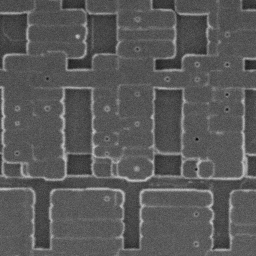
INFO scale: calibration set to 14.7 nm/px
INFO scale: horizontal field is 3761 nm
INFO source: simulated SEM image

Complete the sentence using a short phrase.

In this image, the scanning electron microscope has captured wiring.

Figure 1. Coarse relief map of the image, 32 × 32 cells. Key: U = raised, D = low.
UUUUUUUUDDDUUUUUUUUDDDUUUUUUUUDD
UUUUUUUUUUUUUUUUUUUUUUUUUUUUUUUU
DDDDUUUUUUUDDDDUUUUUUUDDDDUUUUUU
DDDDUUUUUUUDDDDUUUUUUUDDDDUUUUUU
DDDDUUUUUUUDDDDUUUUUUUDDDDUUUUUU
DDDDUUUUUUUDDDDUUUUUUUDDDDUUUUUU
DDDUUUUUUUUDDDUUUUUUUUDDDDUUUUUU
UUUUUUUUUDDDUUUUUUUUDDDUUUUUUUUD
UUUUUUUUUDDUUUUUUUUUDDUUUUUUUUUD
UUUUUUUUUUUUUUUUUUUUUUUUUUUUUUUU
UUUUUUUUUUUUUUUUUUUUUUUUUUUUUUUU
UUUUUUUUDDDDUUUUUUUDDDDUUUUUUUUD
UUUUUUUUDDDDUUUUUUUDDDDUUUUUUUDD
UUUUUUUUDDDDUUUUUUUDDDDUUUUUUUDD
UUUUUUUUDDDDUUUUUUUDDDDUUUUUUUDD
UUUUUUUUDDDDUUUUUUUDDDDUUUUUUUDD
UUUUUUUUDDDDUUUUUUUDDDDUUUUUUUDD
UUUUUUUUDDDDUUUUUUUDDDDUUUUUUUDD
UUUUUUUUDDDDUUUUUUUDDDDUUUUUUUDD
UUUUUUUUDDDDUUUUUUUDDDDUUUUUUUDD
DDUUUUUUDDDDDDUUUUUDDDDDDUUUUUDD
DDDUUUUUDDDDDDUUUUUDDDDDDUUUUUDD
DDDDDDUUDDDDDDDDUUDDDDDDDDDDDDDD
DDDDDDDDDDDDDDDDDDDDDDDDDDDDDDDD
UUUUDDUUUUUUUUUDDDUUUUUUUUUDDUUU
UUUUDDUUUUUUUUUDDDUUUUUUUUUDDUUU
UUUUDDUUUUUUUUUDDDUUUUUUUUUDDUUU
UUUUDDUUUUUUUUUDDDUUUUUUUUUDDUUU
UUUUDDUUUUUUUUUDDDUUUUUUUUUDDUUU
UUUUDDUUUUUUUUUDDDUUUUUUUUUDDUUU
UUUUDDUUUUUUUUUDDDUUUUUUUUUDDUUU
UUUUUUUUUUUUUUUUUUUUUUUUUUUUUUUU